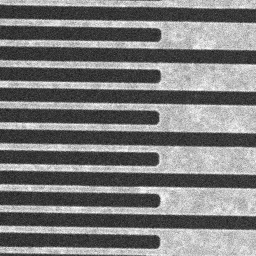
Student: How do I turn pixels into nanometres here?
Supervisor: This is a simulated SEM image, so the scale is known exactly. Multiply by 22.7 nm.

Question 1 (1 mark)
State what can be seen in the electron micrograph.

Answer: parallel lines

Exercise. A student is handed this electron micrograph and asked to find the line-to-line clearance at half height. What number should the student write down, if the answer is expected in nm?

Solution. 335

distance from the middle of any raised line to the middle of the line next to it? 469 nm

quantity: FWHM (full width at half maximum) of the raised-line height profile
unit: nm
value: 130